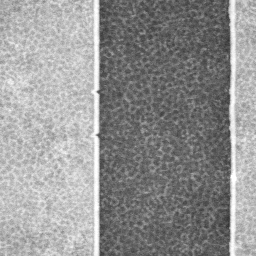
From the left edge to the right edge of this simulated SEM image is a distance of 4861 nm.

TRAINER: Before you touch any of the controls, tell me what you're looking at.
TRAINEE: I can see one or a few lines or trenches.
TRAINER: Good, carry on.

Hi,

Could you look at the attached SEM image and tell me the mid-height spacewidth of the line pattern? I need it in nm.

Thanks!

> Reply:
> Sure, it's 2610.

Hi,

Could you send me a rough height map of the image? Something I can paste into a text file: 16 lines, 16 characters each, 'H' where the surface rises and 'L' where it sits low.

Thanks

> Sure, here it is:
HHHHHHLLLLLLLLLH
HHHHHHLLLLLLLLLH
HHHHHHLLLLLLLLLH
HHHHHHLLLLLLLLLH
HHHHHHLLLLLLLLLH
HHHHHHLLLLLLLLLH
HHHHHHLLLLLLLLLH
HHHHHHLLLLLLLLLH
HHHHHHLLLLLLLLLH
HHHHHHLLLLLLLLLH
HHHHHHLLLLLLLLLH
HHHHHHLLLLLLLLLH
HHHHHHLLLLLLLLLH
HHHHHHLLLLLLLLLH
HHHHHHLLLLLLLLLH
HHHHHHLLLLLLLLLH